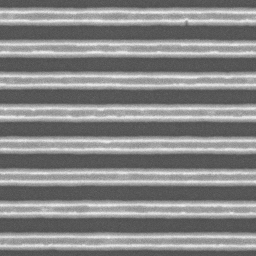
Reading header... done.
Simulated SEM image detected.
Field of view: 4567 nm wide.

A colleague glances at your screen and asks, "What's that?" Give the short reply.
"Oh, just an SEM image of parallel lines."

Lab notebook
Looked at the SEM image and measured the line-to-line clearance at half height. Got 357 nm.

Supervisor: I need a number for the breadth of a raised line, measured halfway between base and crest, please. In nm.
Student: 221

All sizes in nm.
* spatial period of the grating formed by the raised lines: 573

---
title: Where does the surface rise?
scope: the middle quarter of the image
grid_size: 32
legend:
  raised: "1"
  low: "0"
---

00000000000000000000000000000000
00000000000000000000000000000000
00000000000000000000000000000000
11111111111111111111111111111111
11111111111111111111111111111111
00111111111111111111111111111111
00000000000000000000000000000000
00000000000000000000000000000000
00000000000000000000000000000000
00000000000000000000000000000000
00000000000000000000000000000000
11111111111111111111111111111111
11111111111111111111111111111111
11111111111111111111111111111111
00000000000000000000000000000000
00000000000000000000000000000000
00000000000000000000000000000000
00000000000000000000000000000000
00000000000000000000000000000000
11111111111111111111111111111111
11111111111111111111111111111111
11111111111111111111111111111111
00000000000000000000000000000000
00000000000000000000000000000000
00000000000000000000000000000000
00000000000000000000000000000000
00000000000000000000000000000000
11111111111111111111111111111111
11111111111111111111111111111111
11111111111111111111111111111111
00000000000000000000000000000000
00000000000000000000000000000000